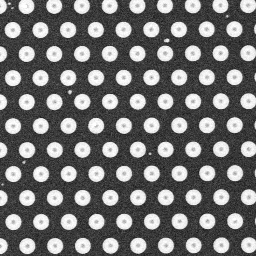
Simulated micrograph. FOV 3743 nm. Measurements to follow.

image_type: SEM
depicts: an array of small figures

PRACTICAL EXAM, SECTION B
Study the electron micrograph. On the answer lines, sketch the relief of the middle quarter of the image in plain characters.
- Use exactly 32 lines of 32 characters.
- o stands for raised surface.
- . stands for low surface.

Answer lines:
................................
................................
ooo...oooo...oooo...oooo...ooo..
ooo...oooo...oooo...oooo...oooo.
ooo...oooo...ooo....ooo....ooo..
................................
................................
................................
...ooo....ooo....ooo....ooo....o
...ooo....ooo....ooo...oooo...oo
...ooo....ooo....ooo....ooo....o
................................
................................
................................
ooo...oooo...oooo...oooo...oooo.
ooo...oooo...oooo...oooo...oooo.
ooo...oooo...oooo...oooo...ooo..
................................
................................
................................
...ooo....ooo....ooo....ooo....o
...ooo....ooo....ooo....ooo....o
...ooo....ooo....ooo....ooo....o
................................
................................
................................
ooo...oooo...oooo...oooo...oooo.
ooo...oooo...oooo...oooo...oooo.
ooo....ooo...oooo...oooo...ooo..
................................
................................
................................